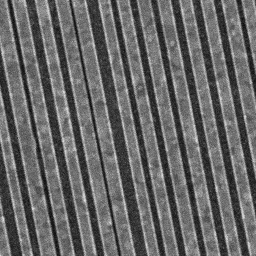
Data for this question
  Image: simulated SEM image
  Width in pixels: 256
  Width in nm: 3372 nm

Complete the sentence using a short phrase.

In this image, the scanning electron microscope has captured parallel lines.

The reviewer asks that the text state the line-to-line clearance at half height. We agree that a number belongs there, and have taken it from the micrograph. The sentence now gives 124 nm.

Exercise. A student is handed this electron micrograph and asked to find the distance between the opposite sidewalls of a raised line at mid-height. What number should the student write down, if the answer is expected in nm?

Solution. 150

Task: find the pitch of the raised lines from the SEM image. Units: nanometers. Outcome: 269